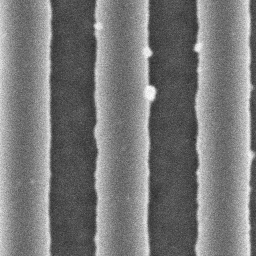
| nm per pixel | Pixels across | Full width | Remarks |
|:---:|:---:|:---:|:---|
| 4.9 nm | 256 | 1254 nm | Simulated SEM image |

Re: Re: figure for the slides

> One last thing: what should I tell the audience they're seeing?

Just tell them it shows lines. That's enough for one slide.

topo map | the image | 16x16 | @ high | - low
@@@---@@@---@@@@
@@@---@@@---@@@@
@@@---@@@---@@@@
@@@---@@@---@@@@
@@@---@@@---@@@@
@@@---@@@@--@@@@
@@@---@@@---@@@@
@@@---@@@---@@@@
@@@---@@@---@@@@
@@@---@@@---@@@@
@@@---@@@---@@@@
@@@---@@@---@@@@
@@@---@@@---@@@@
@@@---@@@---@@@@
@@@---@@@---@@@@
@@@---@@@---@@@@